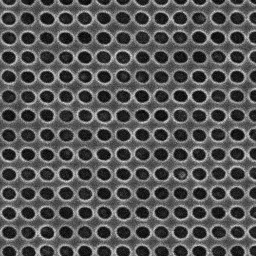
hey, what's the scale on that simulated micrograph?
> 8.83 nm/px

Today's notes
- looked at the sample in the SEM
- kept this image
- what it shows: a regular array of holes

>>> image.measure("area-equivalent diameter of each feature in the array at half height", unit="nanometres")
122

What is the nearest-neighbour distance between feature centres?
166 nanometers